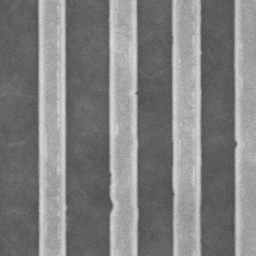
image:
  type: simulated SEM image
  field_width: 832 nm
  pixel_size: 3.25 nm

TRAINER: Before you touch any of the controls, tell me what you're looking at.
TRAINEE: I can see one or a few lines or trenches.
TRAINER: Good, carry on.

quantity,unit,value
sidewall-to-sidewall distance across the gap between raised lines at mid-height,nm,129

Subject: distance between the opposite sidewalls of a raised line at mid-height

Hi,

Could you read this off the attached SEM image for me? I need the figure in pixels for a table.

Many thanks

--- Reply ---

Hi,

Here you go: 22.9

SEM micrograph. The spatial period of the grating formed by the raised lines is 218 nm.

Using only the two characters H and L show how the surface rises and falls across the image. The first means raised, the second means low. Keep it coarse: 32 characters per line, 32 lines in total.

LLLLLHHHLLLLLLHHHLLLLLHHHLLLLLHH
LLLLLHHHLLLLLLHHHLLLLLHHHLLLLLHH
LLLLLHHHLLLLLLHHHLLLLLHHHLLLLLHH
LLLLLHHHLLLLLLHHHLLLLLHHHLLLLLHH
LLLLLHHHLLLLLLHHHLLLLLHHHLLLLLHH
LLLLLHHHLLLLLLHHHLLLLLHHHLLLLLHH
LLLLLHHHLLLLLLHHHLLLLLHHHLLLLLHH
LLLLLHHHLLLLLLHHHLLLLLHHHLLLLLHH
LLLLLHHHLLLLLLHHHLLLLLHHHLLLLLHH
LLLLLHHHLLLLLLHHHLLLLLHHHLLLLLHH
LLLLLHHHLLLLLLHHHLLLLLHHHLLLLLHH
LLLLLHHHLLLLLLHHHLLLLLHHHLLLLLHH
LLLLLHHHLLLLLLHHHLLLLLHHHLLLLLHH
LLLLLHHHLLLLLLHHHLLLLLHHHLLLLLHH
LLLLLHHHLLLLLLHHHLLLLLHHHLLLLLHH
LLLLLHHHLLLLLLHHHLLLLLHHHLLLLLHH
LLLLLHHHLLLLLLHHHLLLLLHHHLLLLLHH
LLLLLHHHLLLLLLHHHLLLLLHHHLLLLLHH
LLLLLHHHLLLLLLHHHLLLLLHHHLLLLLHH
LLLLLHHHLLLLLLHHHLLLLLHHHLLLLLHH
LLLLLHHHLLLLLLHHHLLLLLHHHLLLLLHH
LLLLLHHHLLLLLLHHHLLLLLHHHLLLLLHH
LLLLLHHHLLLLLLHHHLLLLLHHHLLLLLHH
LLLLLHHHLLLLLLHHHLLLLLHHHLLLLLHH
LLLLLHHHLLLLLLHHHLLLLLHHHLLLLLHH
LLLLLHHHLLLLLLHHHLLLLLHHHLLLLLHH
LLLLLHHHLLLLLLHHHLLLLLHHHLLLLLHH
LLLLLHHHLLLLLLHHHLLLLLHHHLLLLLHH
LLLLLHHHLLLLLLHHHLLLLLHHHLLLLLHH
LLLLLHHHLLLLLLHHHLLLLLHHHLLLLLHH
LLLLLHHHLLLLLLHHHLLLLLHHHLLLLLHH
LLLLLHHHLLLLLLHHHLLLLLHHHLLLLLHH